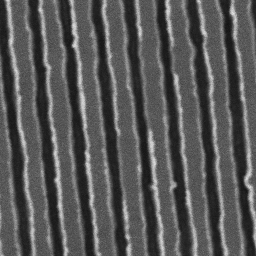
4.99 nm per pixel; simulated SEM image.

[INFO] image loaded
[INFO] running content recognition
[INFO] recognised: parallel lines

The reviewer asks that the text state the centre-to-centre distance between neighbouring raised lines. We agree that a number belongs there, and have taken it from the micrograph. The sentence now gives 0.159 µm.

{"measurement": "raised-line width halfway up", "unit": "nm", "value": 107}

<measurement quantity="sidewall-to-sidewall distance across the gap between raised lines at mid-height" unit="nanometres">53.4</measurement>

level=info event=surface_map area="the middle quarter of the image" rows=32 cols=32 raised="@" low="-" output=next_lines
@--@@@@@---@@@@@---@@@@@@--@@@@@
----@@@@---@@@@@---@@@@@@--@@@@@
---@@@@@----@@@@---@@@@@@--@@@@@
----@@@@----@@@@----@@@@@--@@@@@
@--@@@@@@---@@@@@---@@@@@--@@@@@
@--@@@@@@---@@@@@---@@@@@---@@@@
@---@@@@@---@@@@@---@@@@@---@@@@
@---@@@@@---@@@@@---@@@@@---@@@@
@---@@@@@---@@@@@---@@@@@---@@@@
@---@@@@@---@@@@@---@@@@@---@@@@
@@--@@@@@---@@@@@@--@@@@@---@@@@
@@--@@@@@---@@@@@@--@@@@@@--@@@@
@@--@@@@@----@@@@@--@@@@@@---@@@
@@---@@@@@---@@@@@---@@@@@---@@@
@@---@@@@@---@@@@@---@@@@@---@@@
@@---@@@@@---@@@@@---@@@@@---@@@
@@---@@@@@---@@@@@---@@@@@---@@@
@@---@@@@@---@@@@@@--@@@@@---@@@
@@---@@@@@---@@@@@@--@@@@@---@@@
@@---@@@@@---@@@@@@--@@@@@---@@@
@@----@@@@@--@@@@@@--@@@@@---@@@
@@----@@@@----@@@@@--@@@@@---@@@
@@---@@@@@----@@@@@--@@@@@@--@@@
@@----@@@@@---@@@@@---@@@@@---@@
@@@--@@@@@@---@@@@@---@@@@@---@@
@@@--@@@@@@---@@@@@---@@@@@---@@
@@@---@@@@@---@@@@@---@@@@@---@@
@@@---@@@@@---@@@@@---@@@@@---@@
@@@---@@@@@---@@@@@---@@@@@---@@
@@@---@@@@@@--@@@@@---@@@@@@--@@
@@@---@@@@@@--@@@@@---@@@@@@--@@
@@@---@@@@@@---@@@@---@@@@@----@